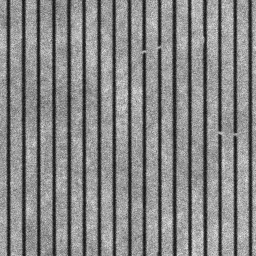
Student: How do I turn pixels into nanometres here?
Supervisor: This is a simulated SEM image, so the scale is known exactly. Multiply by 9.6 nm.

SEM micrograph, parallel lines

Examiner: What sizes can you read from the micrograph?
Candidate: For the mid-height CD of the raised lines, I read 11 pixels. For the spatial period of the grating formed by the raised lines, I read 145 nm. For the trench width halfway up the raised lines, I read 34.8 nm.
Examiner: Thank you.